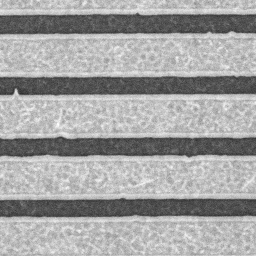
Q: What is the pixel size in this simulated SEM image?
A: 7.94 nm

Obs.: one or a few lines or trenches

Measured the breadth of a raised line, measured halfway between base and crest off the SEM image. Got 305 nm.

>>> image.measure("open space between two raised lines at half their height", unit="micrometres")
0.179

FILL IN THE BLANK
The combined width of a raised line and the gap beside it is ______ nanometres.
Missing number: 486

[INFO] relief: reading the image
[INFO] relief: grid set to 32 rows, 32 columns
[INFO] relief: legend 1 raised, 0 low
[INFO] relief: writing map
11111111111111111111111111111111
11000000000000000010000100000111
00000000000000000000000000000000
00000000000000000000000000000000
00000000000011111110000001101100
11111111111111111111111111111111
11111111111111111111111111111111
11111111111111111111111111111111
11111111111111111111111111111111
00000000000000000000000000000000
00000000000000000000000000000000
00000000000000000000000000000000
11111111111111111111111111111111
11111111111111111111111111111111
11111111111111111111111111111111
11111111111111111111111111111111
11111111111111111111111111111111
00000000000000000000000000000000
00000000000000000000000000000000
00000000000000000000000000000000
11111111111111111111111111111111
11111111111111111111111111111111
11111111111111111111111111111111
11111111111111111111111111111111
11111111111111101111111111011111
00000000000000000000000000000000
00000000000000000000000000000000
00111111100001111111111111111111
11111111111111111111111111111111
11111111111111111111111111111111
11111111111111111111111111111111
11111111111111111111111111111111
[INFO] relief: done